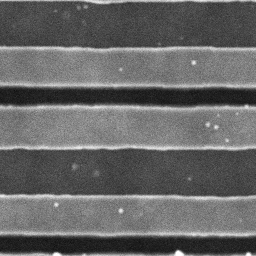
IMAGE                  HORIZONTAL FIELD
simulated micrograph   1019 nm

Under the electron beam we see lines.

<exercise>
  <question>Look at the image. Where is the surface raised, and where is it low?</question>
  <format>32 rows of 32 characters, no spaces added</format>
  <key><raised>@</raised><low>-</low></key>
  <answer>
--------------------------------
--------------------------------
--------------------------------
--------------------------------
--------------------------------
--------------------------------
@@@@@@@@@@@@@@@@@@@@@@@@@@@@@@@@
@@@@@@@@@@@@@@@@@@@@@@@@@@@@@@@@
@@@@@@@@@@@@@@@@@@@@@@@@@@@@@@@@
@@@@@@@@@@@@@@@@@@@@@@@@@@@@@@@@
@@@@@@@@@@@@@@@@@@@@@@@@@@@@@@@@
--------------------------------
--------------------------------
@@@@@@@@@@@@@@@@@@@@@@@-@@@@@@@@
@@@@@@@@@@@@@@@@@@@@@@@@@@@@@@@@
@@@@@@@@@@@@@@@@@@@@@@@@@@@@@@@@
@@@@@@@@@@@@@@@@@@@@@@@@@@@@@@@@
@@@@@@@@@@@@@@@@@@@@@@@@@@@@@@@@
@@-@@@@@@@@--@@---@@@@@@@@@@@@@-
--------------------------------
--------------------------------
--------------------------------
--------------------------------
--------------------------------
@-@@-@@-@-----------------------
@@@@@@@@@@@@@@@@@@@@@@@@@@@@@@@@
@@@@@@@@@@@@@@@@@@@@@@@@@@@@@@@@
@@@@@@@@@@@@@@@@@@@@@@@@@@@@@@@@
@@@@@@@@@@@@@@@@@@@@@@@@@@@@@@@@
--------------------------------
--------------------------------
----------------------@---------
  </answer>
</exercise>